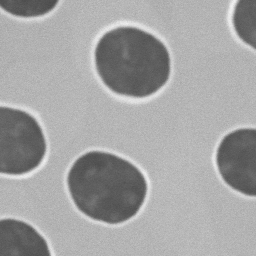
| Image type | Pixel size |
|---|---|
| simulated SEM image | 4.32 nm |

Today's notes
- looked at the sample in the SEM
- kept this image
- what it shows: holes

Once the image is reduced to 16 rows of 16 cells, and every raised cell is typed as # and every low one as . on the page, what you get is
...############.
###############.
######....#####.
######.....#####
######.....#####
#######...######
################
..##############
...###########..
...###.#######..
..##.....#####..
####.....#####..
#####....#######
#####...########
..##############
...#############